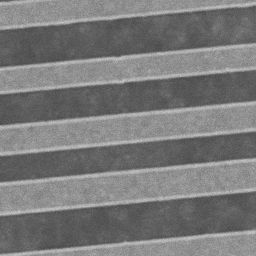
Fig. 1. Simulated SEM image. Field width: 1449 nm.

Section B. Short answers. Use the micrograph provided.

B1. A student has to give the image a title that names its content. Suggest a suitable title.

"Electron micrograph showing one or a few lines or trenches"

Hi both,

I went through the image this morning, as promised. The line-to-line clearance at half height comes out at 0.213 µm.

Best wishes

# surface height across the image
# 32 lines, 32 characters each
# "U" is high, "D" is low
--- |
UUUUUUUUUUUUUUUUUUUUUUUUUUUUUUUD
UUUUUUUUUUUUUUUUUUUUUDDDDDDDDDDD
UUUUUUUUUUDDDDDDDDDDDDDDDDDDDDDD
DDDDDDDDDDDDDDDDDDDDDDDDDDDDDDDD
DDDDDDDDDDDDDDDDDDDDDDDDDDDDDDDD
DDDDDDDDDDDDDDDDDDDDDDDDDDDDDDDD
DDDDDDDDDDDDDDDDDDDDDDDUUUUUUUUU
DDDDDDDDDDDDUUUUUUUUUUUUUUUUUUUU
DDUUUUUUUUUUUUUUUUUUUUUUUUUUUUUU
UUUUUUUUUUUUUUUUUUUUUDDDDDDDDDDD
UUUUUUUUUUUDDDDDDDDDDDDDDDDDDDDD
UDDDDDDDDDDDDDDDDDDDDDDDDDDDDDDD
DDDDDDDDDDDDDDDDDDDDDDDDDDDDDDDD
DDDDDDDDDDDDDDDDDDDDDDDDDDUUUUUU
DDDDDDDDDDDDDDDUUUUUUUUUUUUUUUUU
DDDDDDUUUUUUUUUUUUUUUUUUUUUUUUUU
UUUUUUUUUUUUUUUUUUUUUUUUUUUUUDDD
UUUUUUUUUUUUUUUUUUDDDDDDDDDDDDDD
UUUUUUUUDDDDDDDDDDDDDDDDDDDDDDDD
DDDDDDDDDDDDDDDDDDDDDDDDDDDDDDDD
DDDDDDDDDDDDDDDDDDDDDDDDDDDUUUUU
DDDDDDDDDDDDDDDDUUUUUUUUUUUUUUUU
DDDDDDUUUUUUUUUUUUUUUUUUUUUUUUUU
UUUUUUUUUUUUUUUUUUUUUUUUUUUUUUUU
UUUUUUUUUUUUUUUUUUUUUUUDDDDDDDDD
UUUUUUUUUUUUUDDDDDDDDDDDDDDDDDDD
UUUDDDDDDDDDDDDDDDDDDDDDDDDDDDDD
DDDDDDDDDDDDDDDDDDDDDDDDDDDDDDDD
DDDDDDDDDDDDDDDDDDDDDDDDDDDDDDDD
DDDDDDDDDDDDDDDDDDDDDDDDDDUUUUUU
DDDDDDDDDDDDDDDUUUUUUUUUUUUUUUUU
DDDDDDUUUUUUUUUUUUUUUUUUUUUUUUUU